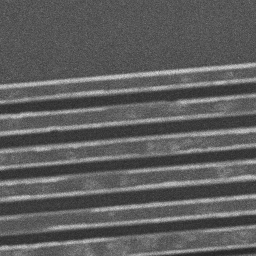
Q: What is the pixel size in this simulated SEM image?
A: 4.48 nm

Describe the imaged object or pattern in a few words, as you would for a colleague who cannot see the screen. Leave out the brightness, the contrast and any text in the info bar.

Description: parallel lines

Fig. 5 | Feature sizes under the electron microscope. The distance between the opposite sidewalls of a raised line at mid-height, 0.0892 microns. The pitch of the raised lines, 146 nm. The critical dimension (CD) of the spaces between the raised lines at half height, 11.8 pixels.